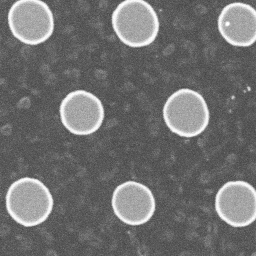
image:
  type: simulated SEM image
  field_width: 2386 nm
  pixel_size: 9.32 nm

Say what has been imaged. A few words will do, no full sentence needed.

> raised bodies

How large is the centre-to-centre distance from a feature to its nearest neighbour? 966 nm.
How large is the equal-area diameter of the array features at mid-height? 405 nm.